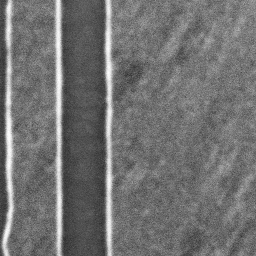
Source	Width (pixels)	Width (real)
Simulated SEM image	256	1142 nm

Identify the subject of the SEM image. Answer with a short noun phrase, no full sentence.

one or a few lines or trenches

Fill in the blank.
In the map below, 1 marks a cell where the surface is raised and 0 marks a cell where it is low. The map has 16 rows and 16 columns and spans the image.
0111000111111111
0111000111111111
0111000111111111
0111000111111111
0111000111111111
0111000111111111
0111000111111111
0111000111111111
0111000111111111
0111000111111111
0111000111111111
0111000111111111
0111000111111111
0111000111111111
1111000111111111
1111000111111111